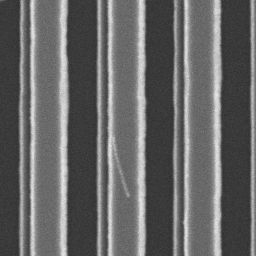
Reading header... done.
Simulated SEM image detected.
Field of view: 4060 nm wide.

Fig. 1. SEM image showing lines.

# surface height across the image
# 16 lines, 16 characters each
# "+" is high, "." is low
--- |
.+++..+++..+++..
.+++..+++..+++..
.+++..+++..+++..
.+++..+++..+++..
.+++..+++..+++..
.+++..+++..+++..
.+++..+++..+++..
.+++..+++..+++..
.+++..+++..+++..
.+++..+++..+++..
.+++..+++..+++..
.+++..+++..+++..
.+++..+++..+++..
.+++..+++..+++..
.+++..+++..+++..
.+++..+++..+++..